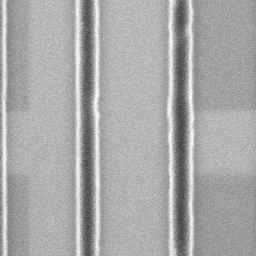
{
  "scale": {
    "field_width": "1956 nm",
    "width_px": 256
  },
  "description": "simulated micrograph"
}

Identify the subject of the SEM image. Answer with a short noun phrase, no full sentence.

one or a few lines or trenches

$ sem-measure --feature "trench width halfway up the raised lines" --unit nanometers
552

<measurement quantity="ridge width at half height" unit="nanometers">160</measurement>